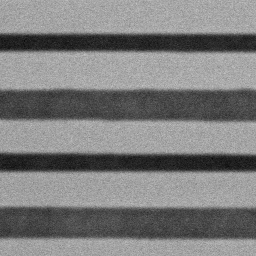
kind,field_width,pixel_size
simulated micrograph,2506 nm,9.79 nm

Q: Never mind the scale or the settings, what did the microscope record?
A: lines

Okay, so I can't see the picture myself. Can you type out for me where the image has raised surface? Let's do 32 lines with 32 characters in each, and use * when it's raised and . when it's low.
********************************
********************************
********************************
********************************
................................
................................
................................
********************************
********************************
********************************
********************************
................................
................................
................................
................................
********************************
********************************
********************************
********************************
................................
................................
................................
********************************
********************************
********************************
********************************
................................
................................
................................
................................
********************************
********************************